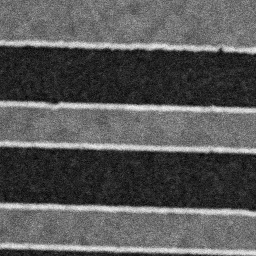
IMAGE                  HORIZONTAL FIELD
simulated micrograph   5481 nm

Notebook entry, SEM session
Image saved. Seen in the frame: one or a few lines or trenches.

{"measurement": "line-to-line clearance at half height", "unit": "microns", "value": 1.33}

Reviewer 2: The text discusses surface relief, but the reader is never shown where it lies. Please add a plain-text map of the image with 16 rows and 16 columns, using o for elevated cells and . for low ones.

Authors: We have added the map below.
oooooooooooooooo
oooooooooooooooo
oooooooooooooooo
................
................
................
................
oooooooooooooooo
oooooooooooooooo
................
................
................
................
oooooooooooooooo
oooooooooooooooo
.....ooooooooooo